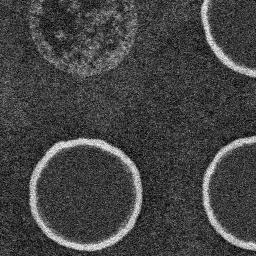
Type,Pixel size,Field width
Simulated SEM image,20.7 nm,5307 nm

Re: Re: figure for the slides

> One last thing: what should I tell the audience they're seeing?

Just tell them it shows raised bodies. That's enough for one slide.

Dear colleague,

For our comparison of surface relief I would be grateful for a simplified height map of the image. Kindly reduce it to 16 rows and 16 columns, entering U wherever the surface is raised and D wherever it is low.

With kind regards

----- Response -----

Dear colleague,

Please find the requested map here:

DDDDDDDDDDDDDUUU
DDDDDDDDDDDDDUUU
DDDDDDDDDDDDDUUU
DDDDDDDDDDDDDDUU
DDDDDDDDDDDDDDDU
DDDDDDDDDDDDDDDD
DDDDDDDDDDDDDDDD
DDDDDDDDDDDDDDDD
DDDDDDDDDDDDDDDD
DDDUUUUDDDDDDDUU
DDUUUUUUDDDDDUUU
DDUUUUUUUDDDDUUU
DDUUUUUUUDDDDUUU
DDUUUUUUDDDDDUUU
DDDUUUUUDDDDDDUU
DDDDDDDDDDDDDDDD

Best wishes